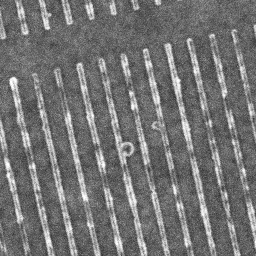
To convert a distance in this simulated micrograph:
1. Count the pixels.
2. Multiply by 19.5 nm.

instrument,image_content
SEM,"parallel lines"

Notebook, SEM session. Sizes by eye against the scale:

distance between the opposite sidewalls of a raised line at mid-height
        90.4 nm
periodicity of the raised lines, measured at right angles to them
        0.439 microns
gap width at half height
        350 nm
